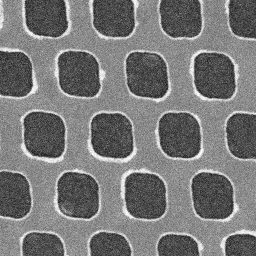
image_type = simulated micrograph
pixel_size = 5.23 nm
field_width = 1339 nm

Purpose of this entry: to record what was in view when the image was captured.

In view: a regular array of holes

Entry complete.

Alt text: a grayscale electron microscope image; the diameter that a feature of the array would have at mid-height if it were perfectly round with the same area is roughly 248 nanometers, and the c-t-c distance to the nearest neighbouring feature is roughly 0.353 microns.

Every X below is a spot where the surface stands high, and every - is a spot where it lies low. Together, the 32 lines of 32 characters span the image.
XXX-----XXXX-----XXX-----XXXX---
XXX-----XXXX-----XXX-----XXXX---
XXX-----XXXX-----XXX-----XXXX---
XXX-----XXXX-----XXX-----XXXX---
XXXXX---XXXXX---XXXXX----XXXXX--
XXXXXXXXXXXXXXXXXXXXXXXXXXXXXXXX
---XXXXX---XXXXXX-XXXXXXXXXXXXXX
----XXX-----XXXX-----XXX-----XXX
----XXX-----XXXX-----XXX-----XXX
----XXX-----XXXX-----XXX-----XXX
----XXX------XXX-----XXX------XX
----XXXX----XXXX-----XXXX----XXX
XXXXXXXXXXXXXXXXXXXXXXXXXXXXXXXX
XXXXXXXXXXXXXXXXXXXXXXXXXXXXXXXX
XXX----XXXXX----XXXX----XXXXX---
XXX-----XXX-----XXXX-----XXX----
XXX-----XXX------XXX-----XXX----
XXX-----XXX------XXX-----XXX----
XXX-----XXXX-----XXX-----XXXX---
XXXX----XXXX----XXXXX----XXXX---
XXXXXXXXXXXXXXXXXXXXXXXXXXXXXXXX
-XXXXXXX--XXXXXXX-XXXXXXXXXXXXXX
---XXXX-----XXXX----XXXX-----XXX
----XXX-----XXXX-----XXX-----XXX
----XXX-----XXXX-----XXX-----XXX
----XXX-----XXXX-----XXX-----XXX
----XXXXX---XXXX-----XXX-----XXX
XXXXXXXXXXXXXXXXXXXXXXXXXX--XXXX
XXXXXXXXXXXXXXXXXXXXXXXXXXXXXXXX
XXX----XXXXX---XXXXX----XXXXX---
XXX-----XXX-----XXXX-----XXX----
XXX-----XXX-----XXXX-----XXX----